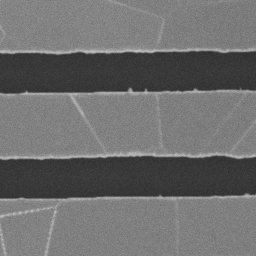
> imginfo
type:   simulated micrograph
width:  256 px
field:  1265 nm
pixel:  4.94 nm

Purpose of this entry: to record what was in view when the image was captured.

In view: lines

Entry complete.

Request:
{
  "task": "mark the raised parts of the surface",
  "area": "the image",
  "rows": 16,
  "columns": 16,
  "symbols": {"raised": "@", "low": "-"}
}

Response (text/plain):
@@@@@@@@@@@@@@@@
@@@@@@@@@@@@@@@@
@@@@@@@@@@@@@@@@
----------------
----------------
----------------
@@@@@@@@@@@@@@@@
@@@@@@@@@@@@@@@@
@@@@@@@@@@@@@@@@
@@@@@@@@@@@@@@@@
----------------
----------------
@@@@@@@@@@@@@@@@
@@@@@@@@@@@@@@@@
@@@@@@@@@@@@@@@@
@@@@@@@@@@@@@@@@